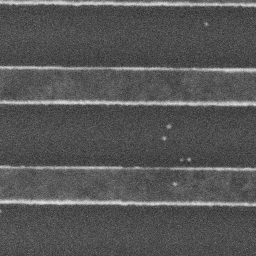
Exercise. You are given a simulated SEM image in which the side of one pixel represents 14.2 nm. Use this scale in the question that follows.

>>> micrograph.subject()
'lines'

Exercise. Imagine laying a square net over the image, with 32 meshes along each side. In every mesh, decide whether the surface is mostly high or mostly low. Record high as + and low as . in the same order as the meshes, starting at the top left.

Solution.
....+..+++++++++++++++++++++++++
................................
................................
................................
................................
................................
................................
................................
+++++++.........................
++++++++++++++++++++++++++++++++
++++++++++++++++++++++++++++++++
++++++++++++++++++++++++++++++++
++++++++++++++++++++++++++++++++
................................
................................
................................
................................
................................
................................
................................
................................
++++++++++++++++++++++++++++++++
++++++++++++++++++++++++++++++++
++++++++++++++++++++++++++++++++
++++++++++++++++++++++++++++++++
...............+..++.+++++++++++
................................
................................
................................
................................
................................
................................